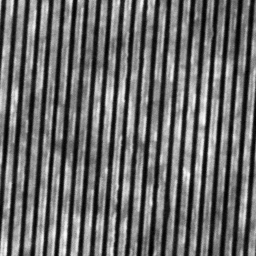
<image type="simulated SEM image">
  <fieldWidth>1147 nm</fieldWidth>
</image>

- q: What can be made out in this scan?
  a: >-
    parallel lines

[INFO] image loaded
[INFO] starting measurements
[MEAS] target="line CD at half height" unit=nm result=31.3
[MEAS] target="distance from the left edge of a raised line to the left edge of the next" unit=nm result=52.9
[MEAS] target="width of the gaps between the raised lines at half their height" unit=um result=0.0235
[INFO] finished